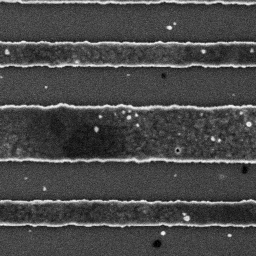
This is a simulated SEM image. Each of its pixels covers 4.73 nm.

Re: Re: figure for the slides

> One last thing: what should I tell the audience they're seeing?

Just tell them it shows lines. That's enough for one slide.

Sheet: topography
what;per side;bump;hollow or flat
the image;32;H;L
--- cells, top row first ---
LLLLLLLLLLLLLLLLLLLLLLLLLLLLLLLL
LLLLLLLLLLLLLLLLLLLLLLLLLLLLLLLL
LLLLLLLLLLLLLLLLLLLLLLLLLLLLLLLL
LLLLLLLLLLLLLLLLLLLLLLLLLLLLLLLL
LLLLLLLLLLLLLLLLLLLLLLLLLLLLLLLL
HHHHHHHHHHHHHHHHHHHHHHHHHHHHHHHH
HHHHHHHHHHHHHHHHHHHHHHHHHHHHHHHH
HHHHHHHHHHHHHHHHHHHHHHHHHHHHHHHH
LLLLLLLLLLLLLLLLLLLLLLLLLLLLLLLL
LLLLLLLLLLLLLLLLLLLLLLLLLLLLLLLL
LLLLLLLLLLLLLLLLLLLLLLLLLLLLLLLL
LLLLLLLLLLLLLLLLLLLLLLLLLLLLLLLL
LLLLLLLLLLLLLLLLLLLLLLLLLLLLLLLL
HHHHHHHHHHHHHHHHHLHHHHHHHLLHHHHH
HHHHHHHHHHHHHHHHHHHHHHHHHHHHHHHH
HHHHHHHHHHHHHHHHHHHHHHHHHHHHHHHH
HHHHHHHHHHHHHHHHHHHHHHHHHHHHHHHH
HHHHHHHHHHHHHHHHHHHHHHHHHHHHHHHH
HHHHHHHHHHHHHHHHHHHHHHHHHHHHHHHH
HHHHHHHHHHHHHHHHHHHHHHHHHHHHHHHH
LLLLLLLLLLLLLLLLLLLLLLLLLLLLLLLL
LLLLLLLLLLLLLLLLLLLLLLLLLLLLLLLL
LLLLLLLLLLLLLLLLLLLLLLLLLLLLLLLL
LLLLLLLLLLLLLLLLLLLLLLLLLLLLLLLL
LLLLLLLLLLLLLLLLLLLLLLLLLLLLLLLL
HHHHHHHHHHHHHHHHHHHHHHHHHHHHHHHH
HHHHHHHHHHHHHHHHHHHHHHHHHHHHHHHH
HHHHHHHHHHHHHHHHHHHHHHHHHHHHHHHH
LLLLLLLLLLLLLLLLLLLLLLLLLLLLLLLL
LLLLLLLLLLLLLLLLLLLLLLLLLLLLLLLL
LLLLLLLLLLLLLLLLLLLLLLLLLLLLLLLL
LLLLLLLLLLLLLLLLLLLLLLLLLLLLLLLL